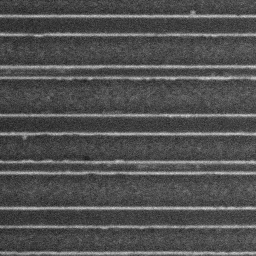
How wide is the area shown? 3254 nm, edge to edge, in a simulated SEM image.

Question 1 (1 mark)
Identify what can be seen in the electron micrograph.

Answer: lines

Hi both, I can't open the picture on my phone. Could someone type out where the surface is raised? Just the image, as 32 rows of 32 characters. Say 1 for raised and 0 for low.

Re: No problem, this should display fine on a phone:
00000000000000000000000000000000
00000000000000000000000000000000
11111111111111111111111111111111
11111111111111111111111111111111
00000000000000000000000000000000
00000000000000000000000000000000
00000000000000000000000000000000
00000000000000000000000000000000
11111111111111111111111111111111
11111111111111111111111111111111
00000000000000000000000000000000
00000000000000000000000000000000
00000000000000000000000000000000
00000000000000000000000000000000
11111111111111111111111111111111
11111111111111111111111111111111
11111111111111111111111111111111
00000000000000000000000000000000
00000000000000000000000000000000
00000000000000000000000000000000
11111111111111111111111111111111
11111111111111111111111111111111
00000000000000000000000000000000
00000000000000000000000000000000
00000000000000000000000000000000
00000000000000000000000000000000
11111111111111111111111111111111
11111111111111111111111111111111
00000000000000000000000000000000
00000000000000000000000000000000
00000000000000000000000000000000
00000000000000000000000000000000